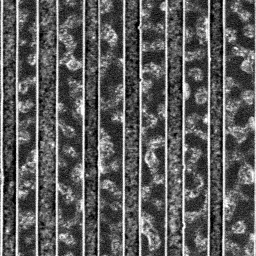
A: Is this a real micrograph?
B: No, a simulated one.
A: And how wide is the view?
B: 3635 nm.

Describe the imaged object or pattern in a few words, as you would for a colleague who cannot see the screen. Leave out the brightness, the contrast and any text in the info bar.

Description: parallel lines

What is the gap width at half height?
0.213 µm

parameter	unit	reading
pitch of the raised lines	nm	602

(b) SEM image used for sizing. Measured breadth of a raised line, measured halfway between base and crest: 26.4 pixels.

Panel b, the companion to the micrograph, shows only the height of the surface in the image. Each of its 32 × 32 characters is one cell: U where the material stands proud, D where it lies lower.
DDUUUDDUUUDDUUUUDDUUUDDUUUDDUUUU
DDUUUDDUUUDDUUUUDDUUUDDUUUDDUUUU
DDUUUDDUUUDDUUUUDDUUUDDUUUDDUUUU
DDUUUDDUUUDDUUUUDUUUUDDUUUDDUUUU
DDUUUDDUUUDDUUUDDDUUUDDUUUDDUUUU
DDUUUDDUUUDDUUUDDDUUUDDUUUDDUUUU
DDUUUDDUUUDDUUUDDDUUUDDUUUDDUUUU
DDUUUDDUUUDDUUUDDDUUUDDUUUDDUUUU
DDUUUDDUUUDDUUUDDDUUUDDUUUDDUUUU
DDUUUDDUUUDDUUUDDDUUUDDUUUDDUUUU
DDUUUDDUUUDDUUUDDDUUUDDUUUDDUUUU
DDUUUDDUUUDDUUUDDDUUUDDUUUDDUUUU
DDUUUDDUUUDDUUUDDDUUUDDUUUDDUUUU
DDUUUDDUUUDDUUUDDDUUUDDUUUDDUUUU
DDUUUDDUUUDDUUUDDDUUUDDUUUDDUUUU
DDUUUDDUUUDDUUUDDDUUUDDUUUDDUUUU
DDUUUDDUUUDDUUUDDDUUUDDUUUDDUUUU
DDUUUDDUUUDDUUUDDDUUUDDUUUDDUUUU
DDUUUDDUUUDDUUUDDDUUUDDUUUDDUUUU
DDUUUDDUUUDDUUUDDDUUUDDUUUDDUUUU
DDUUUDDUUUDDUUUDDDUUUDDUUUDDUUUU
DDUUUDDUUUDDUUUDDDUUUDDUUUDDUUUU
DDUUUDDUUUDDUUUDDDUUUDDUUUDDUUUU
DDUUUDDUUUDDUUUDDDUUUDDUUUDDUUUU
DDUUUDDUUUDDUUUDDUUUUDDUUUDDUUUU
DDUUUDDUUUDDUUUDDUUUUDDUUUDDUUUU
DDUUUDDUUUDDUUUDDUUUUDDUUUDDUUUU
DDUUUDDUUUDDUUUDDUUUUDDUUUDDUUUU
DDUUUDDUUUDDUUUDDDUUUDDUUUDDUUUU
DDUUUDDUUUDDUUUDDDUUUDDUUUDDUUUU
DDUUUDDUUUDDUUUDDDUUUDDUUUDDUUUU
DDUUUDDUUUDDUUUDDDUUUDDUUUDDUUUU